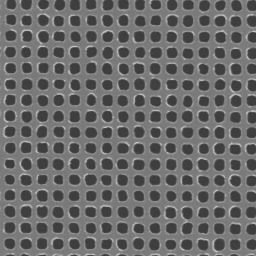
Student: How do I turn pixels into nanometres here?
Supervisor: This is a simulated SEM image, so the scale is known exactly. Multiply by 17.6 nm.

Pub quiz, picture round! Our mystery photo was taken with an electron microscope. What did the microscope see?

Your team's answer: a regular array of holes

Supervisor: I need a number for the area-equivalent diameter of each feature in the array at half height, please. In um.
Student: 0.197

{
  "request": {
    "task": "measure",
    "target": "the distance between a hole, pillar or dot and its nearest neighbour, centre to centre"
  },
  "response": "275 nanometres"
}